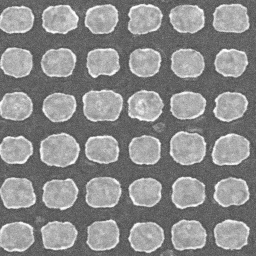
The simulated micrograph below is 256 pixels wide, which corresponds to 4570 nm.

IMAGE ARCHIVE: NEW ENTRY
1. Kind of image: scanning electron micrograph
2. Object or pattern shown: a regular array of raised bodies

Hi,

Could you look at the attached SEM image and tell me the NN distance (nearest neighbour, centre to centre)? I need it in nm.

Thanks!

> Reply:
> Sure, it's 754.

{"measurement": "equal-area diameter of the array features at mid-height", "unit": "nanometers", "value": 563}